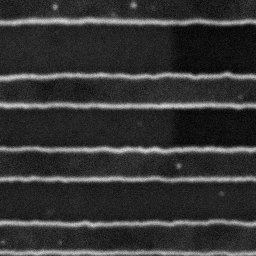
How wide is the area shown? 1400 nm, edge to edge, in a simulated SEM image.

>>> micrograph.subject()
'lines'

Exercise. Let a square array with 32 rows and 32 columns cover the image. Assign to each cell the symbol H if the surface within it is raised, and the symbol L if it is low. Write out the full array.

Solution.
HHHHHHHHHHHHHHHHHHHHHHHHHHHHHHHH
HHHHHHHHHHHHHHHHHHHHHHHHHHHHHHHH
HHHHHHHHHHHHHHHHHHHHHHHHHHHHHHHH
LLLLLLLLLLLLLLLLLLLLLLLLLLLLLLLL
LLLLLLLLLLLLLLLLLLLLLLLLLLLLLLLL
LLLLLLLLLLLLLLLLLLLLLLLLLLLLLLLL
LLLLLLLLLLLLLLLLLLLLLLLLLLLLLLLL
LLLLLLLLLLLLLLLLLLLLLLLLLLLLLLLL
LLLLLLLLLLLLLLLLLLLLLLLLLLLLLLLL
LLLLLLLHHHHHHHHHLLHLHHHHLLLHHLLL
HHHHHHHHHHHHHHHHHHHHHHHHHHHHHHHH
HHHHHHHHHHHHHHHHHHHHHHHHHHHHHHHH
HHHHHHHHHHHHHHHHHHHHHHHHHHHHHHHH
LLLLLLLLLLLLLLLLLLLLLLLLLLLLLLLL
LLLLLLLLLLLLLLLLLLLLLLLLLLLLLLLL
LLLLLLLLLLLLLLLLLLLLLLLLLLLLLLLL
LLLLLLLLLLLLLLLLLLLLLLLLLLLLLLLL
LLLLLLLLLLLLLLLLLLLLLLLLLLLLLLLL
LLLLLLLLLLLLLLLLLLLLLLLLLLLLLLLL
HHHHHHHHHHHHHHHHHHHHHHHHHHHHHHHH
HHHHHHHHHHHHHHHHHHHHHHHHHHHHHHHH
HHHHHHHHHHHHHHHHHHHHHHHHHHHHHHHH
LLLLLLLLLLLLLLLLLLLLLHLLLLLLLLLL
LLLLLLLLLLLLLLLLLLLLLLLLLLLLLLLL
LLLLLLLLLLLLLLLLLLLLLLLLLLLLLLLL
LLLLLLLLLLLLLLLLLLLLLLLLLLLLLLLL
LLLLLLLLLLLLLLLLLLLLLLLLLLLLLLLL
LLLLLLLLLLLLLLLLLLLLLLLLLLLLLLLL
HHHHHHHHHHHHHHHHHHHHHHHHHHHHHHHH
HHHHHHHHHHHHHHHHHHHHHHHHHHHHHHHH
HHHHHHHHHHHHHHHHHHHHHHHHHHHHHHHH
HHHHHHHHHHHHHHHHHHHHHHHHHHHHHHHH